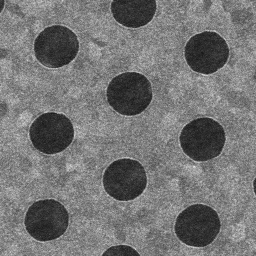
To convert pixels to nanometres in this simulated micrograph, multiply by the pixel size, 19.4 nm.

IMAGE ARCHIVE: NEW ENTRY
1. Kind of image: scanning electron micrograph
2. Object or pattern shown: a regular array of holes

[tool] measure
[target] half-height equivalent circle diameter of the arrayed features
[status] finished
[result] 858 nm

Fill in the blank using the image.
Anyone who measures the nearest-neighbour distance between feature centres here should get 1670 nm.